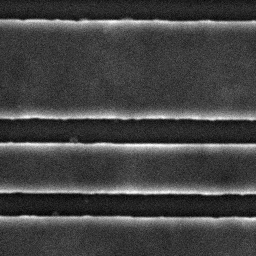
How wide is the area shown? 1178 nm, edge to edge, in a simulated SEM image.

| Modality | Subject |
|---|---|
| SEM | lines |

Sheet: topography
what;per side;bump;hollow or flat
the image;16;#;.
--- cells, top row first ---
................
################
################
################
################
################
################
................
................
################
################
################
................
................
################
################